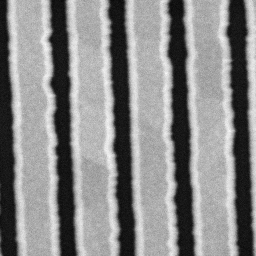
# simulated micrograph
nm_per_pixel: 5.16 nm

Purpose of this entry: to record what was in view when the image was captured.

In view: lines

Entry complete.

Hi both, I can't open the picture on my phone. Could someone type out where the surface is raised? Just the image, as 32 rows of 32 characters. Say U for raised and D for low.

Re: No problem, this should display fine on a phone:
DUUUUUDDUUUUUDDDUUUUUDDUUUUUDDDU
DUUUUUDDDUUUUDDDUUUUUDDUUUUUDDDU
DUUUUUDDDUUUUUDDUUUUUDDUUUUUDDDU
DUUUUUDDDUUUUUDDUUUUUDDUUUUUDDDU
DUUUUUDDDUUUUUDDUUUUUDDUUUUUDDDU
DUUUUUDDDUUUUUDDUUUUUDDUUUUUDDDU
DUUUUUDDDUUUUUDDUUUUUDDDUUUUUDDU
DUUUUUDDDUUUUUDDUUUUUDDUUUUUUDDU
DUUUUUUDDUUUUUDDUUUUUDDUUUUUUDDU
DUUUUUDDDUUUUUDDUUUUUDDUUUUUUDDU
DDUUUUDDDUUUUUDDUUUUUDDDUUUUUDDU
DDUUUUUDDUUUUUDDUUUUUDDDUUUUUDDU
DDUUUUUDDUUUUUDDUUUUUDDDUUUUUDDU
DDUUUUUDDUUUUUDDUUUUUDDDUUUUUDDU
DDUUUUUDDUUUUUDDUUUUUDDDUUUUUDDU
DDUUUUUDDUUUUUDDDUUUUDDDUUUUUDDU
DDUUUUUDDUUUUUDDDUUUUDDDUUUUUDDU
DDUUUUUDDUUUUUDDDUUUUDDDUUUUUDDU
DDUUUUUDDUUUUUDDDUUUUUDDUUUUUDDU
DDUUUUUDDUUUUUDDDUUUUUDDUUUUUDDU
DDUUUUUDDUUUUUDDDUUUUUDDUUUUUDDU
DDUUUUUDDUUUUUDDDUUUUUDDUUUUUDDD
DDUUUUUDDUUUUUDDDUUUUUDDUUUUUDDD
DDUUUUUDDUUUUUDDDUUUUUDDUUUUUDDD
DDUUUUUDDUUUUUDDDUUUUUDDUUUUUDDD
DDUUUUUDDDUUUUDDDUUUUUDDUUUUUDDD
DDUUUUUDDDUUUUDDDUUUUUDDUUUUUDDD
DDUUUUUDDDUUUUDDDUUUUUDDUUUUUDDD
DDUUUUUDDDUUUUUDDUUUUUDDUUUUUDDD
DDUUUUUDDDUUUUUDDUUUUUDDUUUUUDDD
DDUUUUUDDDUUUUUDDUUUUUDDDUUUUDDD
DDUUUUUDDDUUUUUDDUUUUUDDDUUUUUDD